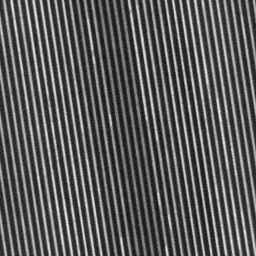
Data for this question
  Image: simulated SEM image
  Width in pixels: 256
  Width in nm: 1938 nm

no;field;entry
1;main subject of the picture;parallel lines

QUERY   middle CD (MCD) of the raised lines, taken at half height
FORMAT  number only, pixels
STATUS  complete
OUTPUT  1.85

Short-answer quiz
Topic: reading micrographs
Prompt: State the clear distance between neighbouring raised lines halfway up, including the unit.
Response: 0.0411 microns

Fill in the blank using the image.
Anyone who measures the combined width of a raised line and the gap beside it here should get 0.055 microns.